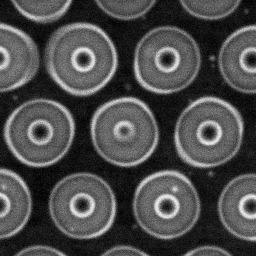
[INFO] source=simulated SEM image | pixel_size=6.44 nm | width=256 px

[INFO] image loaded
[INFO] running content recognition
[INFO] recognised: an array of small figures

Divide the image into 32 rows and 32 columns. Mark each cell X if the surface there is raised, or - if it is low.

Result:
XX------XXXXX------XXXX-------XX
XXX-----XXXXXX----XXXXXX-----XXX
XXXXXXXXXXXXXXXXXXXXXXXXXXXXXXXX
-XXXXXXX----XXXXXXXXXXXXXXXXXXX-
---XXXX------XXXXX-----XXXXXX---
----XX--------XXXX------XXXX----
X---XX----X---XXX---XX---XXX--XX
X---XX---XXX--XXX---XX---XXX--XX
----XX----X---XXX---XX---XXX--XX
----XXX-------XXX-------XXXX----
--XXXXXX-----XXXXX-----XXXXXX---
XXXXXXXXXX-XXXXXXXXXXXXXXXXXXXXX
XXXXXXXXXXXXXXXXXXXXXXXXX--XXXXX
XXX-----XXXXX-----XXXXXX-----XXX
XX-------XXX-------XXXX-------XX
X---XX---XXX---X---XXX---XX---XX
X---XX---XXX--XXX--XXX---XX---XX
X---XX---XXX-------XXX---XX---XX
XX------XXXX-------XXX--------XX
XX------XXXXX-----XXXXX------XXX
XXXX-XXXXXXXXXX-XXXXXXXXX--XXXXX
-XXXXXXXXXXXXXXXXXXXXXXXXXXXXXXX
--XXXXXX----XXXXXX-----XXXXXXX--
---XXXX------XXXX-------XXXX----
----XXX---X---XXX-------XXXX----
X---XX---XXX--XXX---XX---XXX--XX
X---XXX--XX---XXX---XX---XXX--XX
---XXXX-------XXX-------XXXX----
--XXXXXX-----XXXXX------XXXXX---
XXXXXXXXX--XXXXXXXXX--XXXXXXXX--
XXXXXXXXXXXXXXXXXXXXXXXXXXXXXXXX
XXX----XXXXXXX---XXXXXXX----XXXX